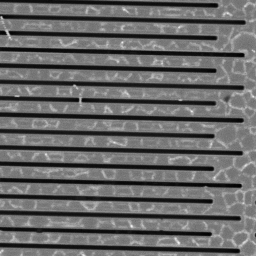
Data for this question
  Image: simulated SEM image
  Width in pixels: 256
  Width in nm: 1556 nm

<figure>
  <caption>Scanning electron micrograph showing parallel lines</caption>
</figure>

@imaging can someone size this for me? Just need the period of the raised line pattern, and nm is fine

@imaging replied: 99.3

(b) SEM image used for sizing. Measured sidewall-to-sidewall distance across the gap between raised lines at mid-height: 27.3 nanometres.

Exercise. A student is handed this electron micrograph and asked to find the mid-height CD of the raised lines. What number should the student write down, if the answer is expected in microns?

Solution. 0.0722